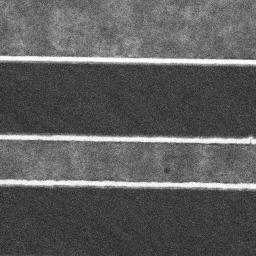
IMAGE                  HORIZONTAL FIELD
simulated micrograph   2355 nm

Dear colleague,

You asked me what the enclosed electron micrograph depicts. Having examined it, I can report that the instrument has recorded one or a few lines or trenches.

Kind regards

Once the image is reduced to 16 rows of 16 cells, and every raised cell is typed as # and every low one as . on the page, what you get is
................
................
................
................
################
################
################
################
################
................
................
#########.......
################
################
################
################